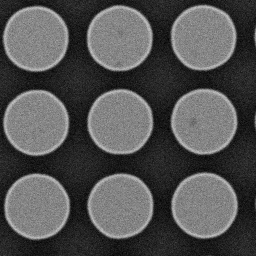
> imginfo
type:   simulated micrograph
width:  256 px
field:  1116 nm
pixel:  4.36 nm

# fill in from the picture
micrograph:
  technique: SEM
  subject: an array of small figures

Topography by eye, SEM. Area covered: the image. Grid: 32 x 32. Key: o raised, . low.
................................
..ooooo......oooo......ooooo....
.ooooooo....oooooo....ooooooo...
.ooooooo...oooooooo...ooooooo...
oooooooo...oooooooo..ooooooooo..
oooooooo...oooooooo..oooooooo...
.ooooooo...oooooooo...ooooooo...
.ooooooo....oooooo.....ooooo....
...ooo.......oooo.......ooo.....
................................
................................
...ooo........ooo.......ooo.....
..ooooo.....oooooo....ooooooo...
.ooooooo...oooooooo...ooooooo...
.oooooooo..oooooooo..ooooooooo..
.oooooooo..oooooooo..ooooooooo..
.ooooooo...oooooooo...ooooooo...
.ooooooo....oooooo....ooooooo...
..ooooo......oooo......ooooo....
................................
................................
................................
..ooooo......oooo......ooooo....
.ooooooo....oooooo....ooooooo...
.ooooooo...oooooooo...oooooooo..
.oooooooo..oooooooo...oooooooo..
.oooooooo..oooooooo...oooooooo..
.ooooooo...oooooooo...ooooooo...
..oooooo....oooooo.....oooooo...
...ooo.......ooo........ooo.....
................................
................................